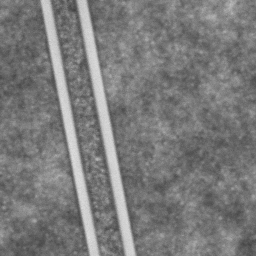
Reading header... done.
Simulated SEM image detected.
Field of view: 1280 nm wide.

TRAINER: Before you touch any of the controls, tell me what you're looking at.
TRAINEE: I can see one or a few lines or trenches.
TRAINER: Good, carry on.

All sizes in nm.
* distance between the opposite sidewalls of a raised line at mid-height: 182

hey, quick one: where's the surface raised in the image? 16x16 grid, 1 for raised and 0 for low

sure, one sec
0001100000000000
0001100000000000
0001110000000000
0001110000000000
0000110000000000
0000110000000000
0000110000000000
0000111000000000
0000111000000000
0000011000000000
0000011000000000
0000011000000000
0000011100000000
0000011100000000
0000001100000000
0000001100000000